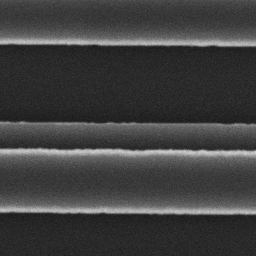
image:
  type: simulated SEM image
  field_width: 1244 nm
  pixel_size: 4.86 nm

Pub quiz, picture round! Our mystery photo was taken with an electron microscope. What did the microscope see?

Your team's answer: lines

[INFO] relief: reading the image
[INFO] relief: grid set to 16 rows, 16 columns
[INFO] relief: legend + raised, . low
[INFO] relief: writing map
++++++++++++++++
++++++++++++++++
++++++++++++++++
................
................
................
................
................
++++++++++++++++
++++++++++++++++
++++++++++++++++
++++++++++++++++
++++++++++++++++
................
................
................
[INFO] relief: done